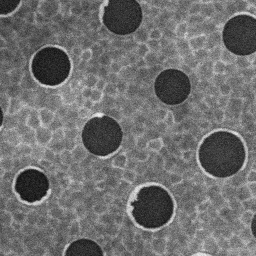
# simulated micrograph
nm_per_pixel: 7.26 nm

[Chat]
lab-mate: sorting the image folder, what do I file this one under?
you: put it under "holes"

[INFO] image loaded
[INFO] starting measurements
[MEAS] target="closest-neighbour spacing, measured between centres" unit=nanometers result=622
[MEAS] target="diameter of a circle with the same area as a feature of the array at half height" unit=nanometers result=289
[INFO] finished